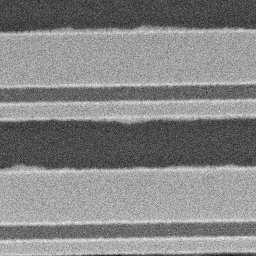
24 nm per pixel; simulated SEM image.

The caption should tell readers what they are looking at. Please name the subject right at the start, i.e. lines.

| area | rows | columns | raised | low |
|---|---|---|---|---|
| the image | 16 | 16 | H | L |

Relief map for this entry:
LLLLLLLLLLLLLLLL
LLLLLLLLLLLLLLLL
HHHHHHHHHHHHHHHH
HHHHHHHHHHHHHHHH
HHHHHHHHHHHHHHHH
HHHHHHHHHHHHHHHH
HHHHHHHHHHHHHHHH
LLLLLLLLLLLLLLLL
LLLLLLLLLLLLLLLL
LLLLLLLLLLLLLLLL
LLLLLLLLLLLLLHHH
HHHHHHHHHHHHHHHH
HHHHHHHHHHHHHHHH
HHHHHHHHHHHHHHHH
HHHHHHHHHHHHHHHH
HHHHHHHHHHHHHHHH